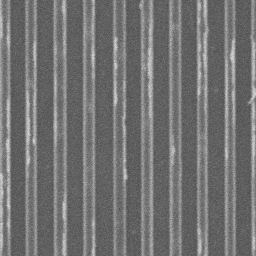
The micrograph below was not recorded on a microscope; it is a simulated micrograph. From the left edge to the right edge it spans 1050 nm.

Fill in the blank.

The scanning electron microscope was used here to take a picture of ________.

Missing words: parallel lines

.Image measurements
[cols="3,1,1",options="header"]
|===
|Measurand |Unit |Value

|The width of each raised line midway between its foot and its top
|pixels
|10.5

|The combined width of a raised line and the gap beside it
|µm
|0.117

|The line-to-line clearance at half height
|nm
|72.2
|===